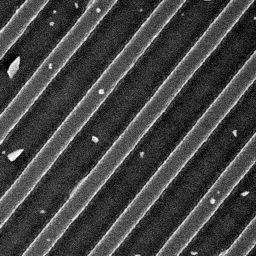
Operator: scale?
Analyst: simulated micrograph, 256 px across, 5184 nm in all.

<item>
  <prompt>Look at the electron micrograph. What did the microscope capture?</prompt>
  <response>lines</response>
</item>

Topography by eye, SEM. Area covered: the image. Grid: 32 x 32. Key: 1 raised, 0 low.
00011100000111000000111000000110
00111000000110000001110000001100
01110000001110000011100000011100
11100000011100000011000000111000
11000000111000000111000001110000
11000001110000001110000011100000
10000001100000011100000011000000
00000011000000111000000111000001
01000111000001110000001110000011
00001110000001100000011100000111
00011100000011100000111000000110
00111000000111000000110000001110
00110000001110000001100000011100
01110000011100000011100000111000
11100000011000000111000001110000
11000000111000001110000001100000
10000001110000001100000011000000
00000011100000011000000111000001
00000111000000111000001110000011
00000110000001110000011100000011
00001110000011100000111000000111
00011100000111000000110000001110
00111000000110000001100000011100
01110000001110000011100000111000
11100000011100000111000000110000
11000000111000001110000001110000
11000001110000011100000011100000
10000011100000011000000111000000
00000011000000111000001110000001
00000111000001110000011100000011
00001110000011100000011000000111
00011100000111000000111000001110